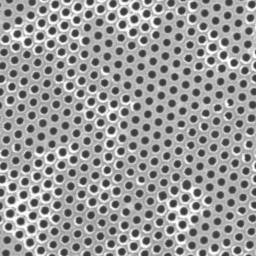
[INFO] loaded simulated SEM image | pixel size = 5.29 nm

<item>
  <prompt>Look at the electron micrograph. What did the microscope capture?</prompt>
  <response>a regular array of holes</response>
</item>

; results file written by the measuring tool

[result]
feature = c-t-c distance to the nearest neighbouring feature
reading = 69.1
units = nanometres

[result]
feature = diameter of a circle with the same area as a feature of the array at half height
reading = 0.0387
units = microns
